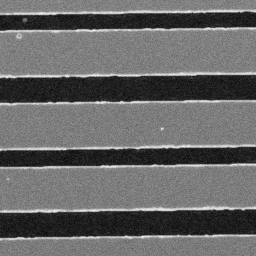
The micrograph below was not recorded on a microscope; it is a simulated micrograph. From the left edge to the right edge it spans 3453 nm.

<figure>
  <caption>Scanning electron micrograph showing lines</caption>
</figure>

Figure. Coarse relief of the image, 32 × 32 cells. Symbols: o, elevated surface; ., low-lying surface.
oooooooooooooooooooooooooooooooo
ooooooooooooooooooooo.oo........
................................
................................
oooooooooooooooooooooooooooooooo
oooooooooooooooooooooooooooooooo
oooooooooooooooooooooooooooooooo
oooooooooooooooooooooooooooooooo
oooooooooooooooooooooooooooooooo
oooooooo........................
................................
................................
................................
oooooooooooooooooooooooooooooooo
oooooooooooooooooooooooooooooooo
oooooooooooooooooooooooooooooooo
oooooooooooooooooooooooooooooooo
oooooooooooooooooooooooooooooooo
ooooooooooooooo.................
................................
................................
oooooooooooooooooooooooooooooooo
oooooooooooooooooooooooooooooooo
oooooooooooooooooooooooooooooooo
oooooooooooooooooooooooooooooooo
oooooooooooooooooooooooooooooooo
ooooo...........................
................................
................................
.........................ooooooo
oooooooooooooooooooooooooooooooo
oooooooooooooooooooooooooooooooo